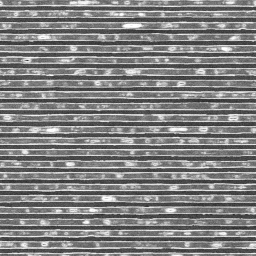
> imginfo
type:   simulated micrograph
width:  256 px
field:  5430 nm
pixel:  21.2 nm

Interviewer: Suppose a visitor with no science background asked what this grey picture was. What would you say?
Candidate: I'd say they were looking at parallel lines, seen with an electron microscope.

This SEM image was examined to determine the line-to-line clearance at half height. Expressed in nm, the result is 106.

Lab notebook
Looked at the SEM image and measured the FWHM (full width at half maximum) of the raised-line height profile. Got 143 nanometres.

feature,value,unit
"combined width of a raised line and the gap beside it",244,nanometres